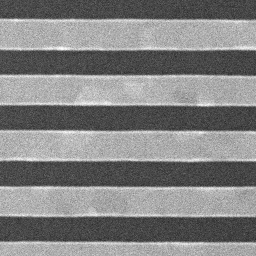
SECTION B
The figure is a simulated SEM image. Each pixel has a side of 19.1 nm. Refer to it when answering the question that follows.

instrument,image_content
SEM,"wiring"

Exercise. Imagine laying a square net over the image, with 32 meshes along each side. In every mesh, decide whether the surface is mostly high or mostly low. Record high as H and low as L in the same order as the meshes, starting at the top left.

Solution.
LLLLLLLLLLLLLLLLLLLLLLLLLLLLLLLL
LLLLLLLLLLLLLLLLLLLLLLLLLLLLLLLL
HHHHHLLLLLLLLLHHHLLLLLLLLLLLLLLL
HHHHHHHHHHHHHHHHHHHHHHHHHHHHHHHH
HHHHHHHHHHHHHHHHHHHHHHHHHHHHHHHH
HHHHHHHLHHHHHHHHHHHHHHHHHHHHHHHH
LLLLLLLLLLLLLLLLLLLLLLLLLLLLLLLL
LLLLLLLLLLLLLLLLLLLLLLLLLLLLLLLL
LLLLLLLLLLLLLLLLLLLLLLLLLLLLLLLL
LLLLLLLLLLLLLLLLLLLLLLLLLLLLLLLL
HHHHHHHHHHHHHHHHHHHHHHHHHHHHHHHH
HHHHHHHHHHHHHHHHHHHHHHHHHHHHHHHH
HHHHHHHHHHHHHHHHHHHHHHHHHHHHHHHH
LLLLLLLLLLLLLLLLLLLLLLLLLLLLLLLL
LLLLLLLLLLLLLLLLLLLLLLLLLLLLLLLL
LLLLLLLLLLLLLLLLLLLLLLLLLLLLLLLL
HHHHHHHHHHHHHHHHHHHHHHHHHHHHHHHH
HHHHHHHHHHHHHHHHHHHHHHHHHHHHHHHH
HHHHHHHHHHHHHHHHHHHHHHHHHHHHHHHH
HHHHHHHHHHHHHHHHHHHHHHHHHHHHHHHH
LLLLLLLLLLLLLLLLLLLLLLLLLLLLLLLL
LLLLLLLLLLLLLLLLLLLLLLLLLLLLLLLL
LLLLLLLLLLLLLLLLLLLLLLLLLLLLLLLL
HHHHHHHHHHHHHHHHHHHHHHHHHHHHHHHH
HHHHHHHHHHHHHHHHHHHHHHHHHHHHHHHH
HHHHHHHHHHHHHHHHHHHHHHHHHHHHHHHH
HHHHHHHHHHHHHHHHHHHHHHHHHHHHHHHH
LLLLLLLLLLLLLLLLLLLLLLLLLLLLLLLL
LLLLLLLLLLLLLLLLLLLLLLLLLLLLLLLL
LLLLLLLLLLLLLLLLLLLLLLLLLLLLLLLL
HHHHHHHHHHHHHHHHHHHHHHHHHHHHHHHH
HHHHHHHHHHHHHHHHHHHHHHHHHHHHHHHH